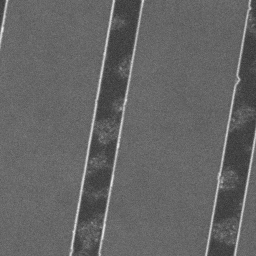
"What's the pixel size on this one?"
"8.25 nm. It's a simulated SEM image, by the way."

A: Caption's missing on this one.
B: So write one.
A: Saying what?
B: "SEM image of one or a few lines or trenches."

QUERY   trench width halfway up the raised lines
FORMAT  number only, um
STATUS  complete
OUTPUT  0.871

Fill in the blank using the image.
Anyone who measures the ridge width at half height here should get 0.239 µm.